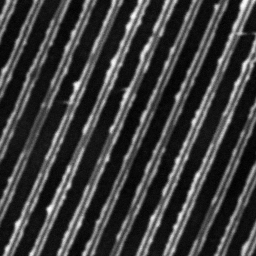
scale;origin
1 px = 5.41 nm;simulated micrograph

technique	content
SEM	parallel lines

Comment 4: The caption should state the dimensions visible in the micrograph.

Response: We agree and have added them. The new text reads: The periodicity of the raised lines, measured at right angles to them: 24.3 pixels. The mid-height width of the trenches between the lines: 82.7 nanometers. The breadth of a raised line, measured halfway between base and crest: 46 nm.